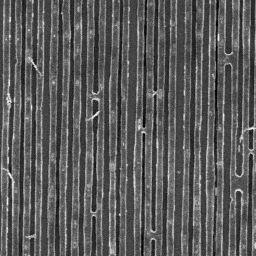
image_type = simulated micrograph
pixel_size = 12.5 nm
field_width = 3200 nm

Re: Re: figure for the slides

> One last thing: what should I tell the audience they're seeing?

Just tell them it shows parallel lines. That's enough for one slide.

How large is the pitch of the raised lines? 150 nanometers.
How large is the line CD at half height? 86 nanometers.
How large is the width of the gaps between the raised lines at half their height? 62.5 nanometers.